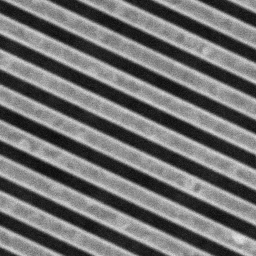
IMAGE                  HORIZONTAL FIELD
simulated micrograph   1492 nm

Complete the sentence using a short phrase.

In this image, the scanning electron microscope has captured parallel lines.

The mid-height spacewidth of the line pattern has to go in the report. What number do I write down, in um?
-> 0.0882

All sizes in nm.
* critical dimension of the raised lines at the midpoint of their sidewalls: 98.8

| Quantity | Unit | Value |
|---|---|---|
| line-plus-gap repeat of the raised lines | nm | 187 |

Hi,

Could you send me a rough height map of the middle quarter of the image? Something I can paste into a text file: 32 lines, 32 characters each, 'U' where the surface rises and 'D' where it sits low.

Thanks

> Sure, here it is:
DDUUUUUUUUUDDDDDDDDDUUUUUUUUUUDD
DDDDUUUUUUUUUDDDDDDDDDUUUUUUUUUU
DDDDDDUUUUUUUUUDDDDDDDDDDUUUUUUU
DDDDDDDDUUUUUUUUUDDDDDDDDDDUUUUU
UDDDDDDDDDDUUUUUUUUDDDDDDDDDDUUU
UUUDDDDDDDDDUUUUUUUUUDDDDDDDDDDU
UUUUUDDDDDDDDDDUUUUUUUUDDDDDDDDD
UUUUUUUDDDDDDDDDUUUUUUUUUDDDDDDD
UUUUUUUUUDDDDDDDDDUUUUUUUUUUDDDD
DDUUUUUUUUUDDDDDDDDDDUUUUUUUUUDD
DDDDUUUUUUUUUUDDDDDDDDDUUUUUUUUU
DDDDDDUUUUUUUUUUDDDDDDDDDUUUUUUU
DDDDDDDDUUUUUUUUUUDDDDDDDDDUUUUU
UDDDDDDDDDDUUUUUUUUUDDDDDDDDDUUU
UUUDDDDDDDDDDUUUUUUUUUDDDDDDDDDU
UUUUUDDDDDDDDDDUUUUUUUUUDDDDDDDD
UUUUUUUUDDDDDDDDDUUUUUUUUUDDDDDD
UUUUUUUUUUDDDDDDDDDUUUUUUUUUDDDD
DDDUUUUUUUUUDDDDDDDDDUUUUUUUUUUD
DDDDDUUUUUUUUUDDDDDDDDDUUUUUUUUU
DDDDDDDUUUUUUUUUDDDDDDDDDDUUUUUU
DDDDDDDDDUUUUUUUUUDDDDDDDDDDUUUU
UDDDDDDDDDDUUUUUUUUUDDDDDDDDDDUU
UUUUDDDDDDDDDUUUUUUUUUDDDDDDDDDD
UUUUUUDDDDDDDDDUUUUUUUUUDDDDDDDD
UUUUUUUUDDDDDDDDDUUUUUUUUUUDDDDD
DUUUUUUUUUDDDDDDDDDUUUUUUUUUUDDD
DDDUUUUUUUUUDDDDDDDDDDUUUUUUUUUD
DDDDDUUUUUUUUUDDDDDDDDDDUUUUUUUU
DDDDDDDUUUUUUUUUDDDDDDDDDDUUUUUU
DDDDDDDDDUUUUUUUUUDDDDDDDDDDUUUU
UUDDDDDDDDDUUUUUUUUUDDDDDDDDDDUU